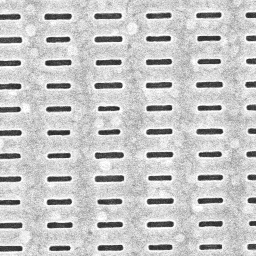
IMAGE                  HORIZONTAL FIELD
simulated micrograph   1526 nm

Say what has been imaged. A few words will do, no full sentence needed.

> a regular array of holes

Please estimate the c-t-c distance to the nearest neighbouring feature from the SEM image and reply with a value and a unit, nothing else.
137 nm